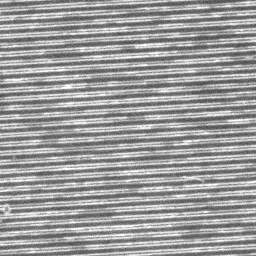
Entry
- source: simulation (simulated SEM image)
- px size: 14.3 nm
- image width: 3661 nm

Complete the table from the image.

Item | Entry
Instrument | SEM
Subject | parallel lines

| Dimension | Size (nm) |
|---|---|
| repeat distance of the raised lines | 128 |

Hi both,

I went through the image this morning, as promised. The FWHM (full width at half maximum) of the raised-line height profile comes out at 98.2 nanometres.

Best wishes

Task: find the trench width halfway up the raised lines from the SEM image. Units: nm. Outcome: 32.1